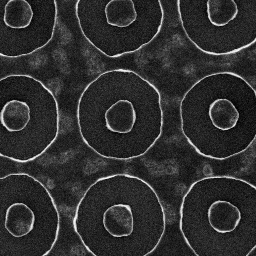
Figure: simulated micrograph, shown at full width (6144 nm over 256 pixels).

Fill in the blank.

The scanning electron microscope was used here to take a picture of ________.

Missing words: ring-shaped grooves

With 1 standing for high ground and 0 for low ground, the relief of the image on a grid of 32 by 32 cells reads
01110001110000111000110000111000
01110001110001111000110000111100
01110001110001111000111000111000
00000001110000000000111000000000
00000011111000000001111100000000
00000011111100000011111100000001
00001111111110001111111111000111
11111111111111111111111111111111
11111111111111111111111111111111
10011111111110000111111111000011
00000111111000000001111110000001
00000011111000000000111100000000
00000001110000000000111000010000
01110001110000111000111000111000
11110001110001111000111000111100
11100001110001111000111000011000
00000001110000010000111000000000
00000001111000000001111100000000
00000011111100000001111100000001
10000111111110000111111111000111
11111111111111111111111111111111
11111111111111111111111111111111
00001111111110000011111110000011
00000011111000000001111100000000
00000011111000000000111000000000
00100001110000000000111000011000
01110001110001110000111000111100
01110001100001111000111000111100
01110001100001111000111000011000
00100001110000000000111000000000
00000001111000000000111100000000
00000011111100000001111100000001